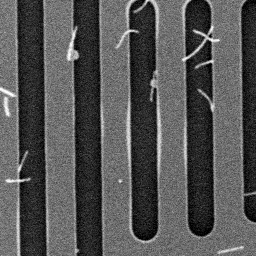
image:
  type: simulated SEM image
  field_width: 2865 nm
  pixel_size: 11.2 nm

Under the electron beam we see groups of lines, slits or small figures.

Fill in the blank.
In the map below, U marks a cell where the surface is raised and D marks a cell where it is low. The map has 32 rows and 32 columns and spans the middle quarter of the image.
UUDDDDDDDUUUUUUUDDDDDDDUUUUUUUDD
UUDDDDDDDUUUUUUUDDDDDDDUUUUUUUDD
UUDDDDDDDUUUUUUUDDDDDDDUUUUUUUDD
UUDDDDDDDUUUUUUUDDDDDDDUUUUUUUDD
UUDDDDDDDUUUUUUUDDDDDDDUUUUUUUDD
UUDDDDDDDUUUUUUUDDDDDDDUUUUUUUDD
UUDDDDDDDUUUUUUUDDDDDDDUUUUUUUDD
UUDDDDDDDUUUUUUUDDDDDDDUUUUUUUDD
UUDDDDDDDUUUUUUUDDDDDDDUUUUUUUDD
UUDDDDDDDUUUUUUUDDDDDDDUUUUUUUDD
UUDDDDDDDUUUUUUUDDDDDDDUUUUUUUDD
UUDDDDDDDUUUUUUUDDDDDDDUUUUUUUDD
UUDDDDDDDUUUUUUUDDDDDDDDUUUUUUDD
UUDDDDDDDUUUUUUUDDDDDDDDUUUUUUDD
UUDDDDDDDUUUUUUUDDDDDDDDUUUUUUDD
UUDDDDDDDDUUUUUUDDDDDDDDUUUUUUDD
UUDDDDDDDDUUUUUUDDDDDDDDUUUUUUDD
UUDDDDDDDUUUUUUUDDDDDDDDUUUUUUDD
UUDDDDDDDUUUUUUUDDDDDDDDUUUUUUDD
UUDDDDDDDUUUUUUUDDDDDDDDUUUUUUDD
UUUDDDDDDUUUUUUUDDDDDDDDUUUUUUDD
UUUDDDDDDUUUUUUUDDDDDDDDUUUUUUDD
UUUDDDDDDUUUUUUUDDDDDDDDUUUUUUDD
UUUDDDDDDUUUUUUUDDDDDDDDUUUUUUDD
UUUDDDDDDUUUUUUUDDDDDDDDUUUUUUDD
UUUDDDDDDUUUUUUUDDDDDDDDUUUUUUDD
UUUDDDDDDUUUUUUUDDDDDDDDUUUUUUDD
UUUDDDDDDUUUUUUUUDDDDDDUUUUUUUDD
UUUDDDDDDDUUUUUUUDDDDDDUUUUUUUUD
UUUDDDDDDDUUUUUUUDDDDDDUUUUUUUUD
UUUDDDDDDDUUUUUUUDDDDDDUUUUUUUUD
UUUDDDDDDDUUUUUUUDDDDDDDUUUUUUUD